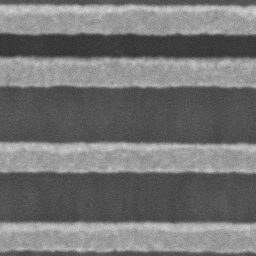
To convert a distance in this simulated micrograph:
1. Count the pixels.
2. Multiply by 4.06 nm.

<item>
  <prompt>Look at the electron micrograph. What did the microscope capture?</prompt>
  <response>lines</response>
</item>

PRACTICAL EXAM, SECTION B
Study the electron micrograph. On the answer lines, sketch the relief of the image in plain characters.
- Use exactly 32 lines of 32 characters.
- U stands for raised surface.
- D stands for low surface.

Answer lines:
DDDDDDDDDDDDDDDDDDDDDDDDDDDDDDDD
UUUUUUUUUUUUUUUUUUUUUUUUUUUUUUUU
UUUUUUUUUUUUUUUUUUUUUUUUUUUUUUUU
UUUUUUUUUUUUUUUUUUUUUUUUUUUUUUUU
DDDDDDDDDDDDDDDDDDDDDDDDDDDDDDDD
DDDDDDDDDDDDDDDDDDDDDDDDDDDDDDDD
DDDDDDDDDDDDDDDDDDDDDDDDDDDDDDDD
UUUUUUUUUUDUUUUUUUUUUUDUDDDDUDDD
UUUUUUUUUUUUUUUUUUUUUUUUUUUUUUUU
UUUUUUUUUUUUUUUUUUUUUUUUUUUUUUUU
UUUUUUUUUUUUUUUUUUUUUUUUUUUUUUUU
DDDDDDDDDDDDDDDDDDDDDDDDDDDDDDDD
DDDDDDDDDDDDDDDDDDDDDDDDDDDDDDDD
DDDDDDDDDDDDDDDDDDDDDDDDDDDDDDDD
DDDDDDDDDDDDDDDDDDDDDDDDDDDDDDDD
DDDDDDDDDDDDDDDDDDDDDDDDDDDDDDDD
DDDDDDDDDDDDDDDDDDDDDDDDDDDDDDDD
DDDDDDDDDDDDDDDDDDDDDDDDDDDDDDDD
UUUUUUUUUUUUUUUUUUUUUUUUUUUUUUUU
UUUUUUUUUUUUUUUUUUUUUUUUUUUUUUUU
UUUUUUUUUUUUUUUUUUUUUUUUUUUUUUUU
DDDDDDDUDUUDDUDDDDDDDDDDDDDDDDUU
DDDDDDDDDDDDDDDDDDDDDDDDDDDDDDDD
DDDDDDDDDDDDDDDDDDDDDDDDDDDDDDDD
DDDDDDDDDDDDDDDDDDDDDDDDDDDDDDDD
DDDDDDDDDDDDDDDDDDDDDDDDDDDDDDDD
DDDDDDDDDDDDDDDDDDDDDDDDDDDDDDDD
DDDDDDDDDDDDDDDDDDDDDDDDDDDDDDDD
UUUUUUUUUUUUUUUUUUUUUUUUUUUUUUUU
UUUUUUUUUUUUUUUUUUUUUUUUUUUUUUUU
UUUUUUUUUUUUUUUUUUUUUUUUUUUUUUUU
DDDDDDDDDDDDDDDDDDDDDDDDDDDUUUDD